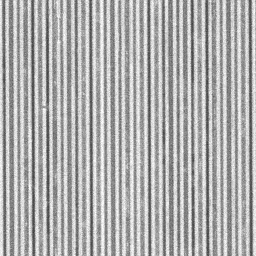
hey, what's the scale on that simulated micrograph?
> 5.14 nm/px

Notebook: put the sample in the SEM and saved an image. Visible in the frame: parallel lines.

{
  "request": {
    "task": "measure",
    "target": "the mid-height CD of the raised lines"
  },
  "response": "15.4 nanometers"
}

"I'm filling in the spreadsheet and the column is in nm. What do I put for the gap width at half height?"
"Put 20.5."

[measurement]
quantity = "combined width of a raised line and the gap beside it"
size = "37.3 nanometres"